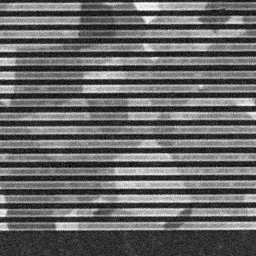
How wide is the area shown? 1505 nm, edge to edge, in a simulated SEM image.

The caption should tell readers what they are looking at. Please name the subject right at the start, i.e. parallel lines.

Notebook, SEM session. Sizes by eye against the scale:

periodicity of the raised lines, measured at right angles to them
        0.0806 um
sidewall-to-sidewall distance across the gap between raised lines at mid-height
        6.75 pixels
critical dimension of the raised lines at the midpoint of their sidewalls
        0.0397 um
